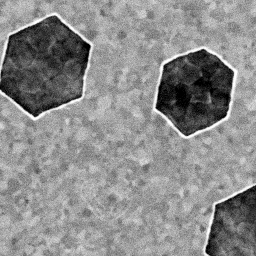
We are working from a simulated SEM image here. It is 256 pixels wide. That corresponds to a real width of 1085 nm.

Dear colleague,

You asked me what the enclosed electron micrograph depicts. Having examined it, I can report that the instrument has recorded holes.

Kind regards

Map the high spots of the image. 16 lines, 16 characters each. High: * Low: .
****************
**..************
*....***********
......*****...**
.....*****.....*
.....*****.....*
*...******....**
**********....**
****************
****************
****************
****************
**************..
*************...
*************...
*************...